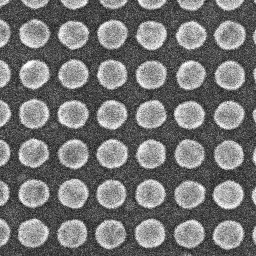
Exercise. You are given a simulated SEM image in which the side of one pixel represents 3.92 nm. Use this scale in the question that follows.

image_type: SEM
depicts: a regular array of raised bodies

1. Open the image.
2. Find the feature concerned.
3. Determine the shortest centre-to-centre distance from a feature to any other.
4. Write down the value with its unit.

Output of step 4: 152 nm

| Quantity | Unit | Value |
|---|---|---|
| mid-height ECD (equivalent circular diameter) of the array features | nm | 110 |